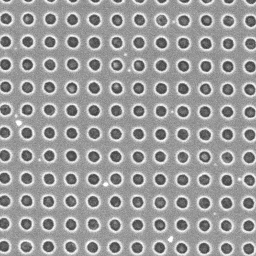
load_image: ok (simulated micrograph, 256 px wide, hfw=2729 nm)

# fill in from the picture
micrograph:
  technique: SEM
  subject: a regular array of holes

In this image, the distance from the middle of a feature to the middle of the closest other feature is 236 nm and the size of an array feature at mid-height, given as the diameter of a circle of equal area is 11.7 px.